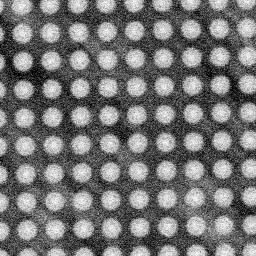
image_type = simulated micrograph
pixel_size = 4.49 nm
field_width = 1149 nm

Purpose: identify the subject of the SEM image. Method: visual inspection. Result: an array of small figures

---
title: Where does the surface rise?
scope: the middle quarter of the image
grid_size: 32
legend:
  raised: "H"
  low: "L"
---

LLHHHHLLLHHHLLLLHHHLLLLLHHLLLLLH
LLLLLLLLLLLLLLLLLLLLLLLLLLLLLLLL
LLLLLLLLLLLLLLLLLLLLLLLLLLLLLLLL
LLLLLLLLLLLLLLLLLLLLLLLLHHLLLLLH
LLHHHHLLLHHHHLLLHHHHLLLHHHHLLLHH
LLHHHHLLLHHHHLLLHHHHLLLHHHHLLLHH
LLHHHHLLLHHHHLLLHHHHLLLHHHHLLLHH
LLHHHHLLLHHHHLLLHHHHLLLLHHLLLLLH
LLLLLLLLLLLLLLLLLLLLLLLLLLLLLLLL
LLLLLLLLLLLLLLLLLLLLLLLLLLLLLLLL
LLLLLLLLLLLLLLLLLLLLLLLLHHLLLLLH
LLLHHHLLLHHHHLLLHHHHLLLHHHHLLLHH
LLHHHHLLLHHHHLLLHHHHLLLHHHHLLLHH
LLHHHHLLLHHHHLLLHHHHLLLHHHHLLLHH
LLHHHHLLLLHHHLLLLHHHLLLLHHHLLLLH
LLLLLLLLLLLLLLLLLLLLLLLLLLLLLLLL
LLLLLLLLLLLLLLLLLLLLLLLLLLLLLLLL
LLLLLLLLLLLLLLLLLLLLLLLLLHLLLLLH
LLLHHHLLLLHHHLLLLHHHLLLHHHHLLLHH
LLHHHHHLLHHHHHLLHHHHHLLHHHHHLLHH
LLHHHHHLLHHHHHLLHHHHHLLHHHHLLLHH
LLHHHHLLLLHHHLLLLHHHLLLLHHHLLLLH
LLLLLLLLLLLLLLLLLLLLLLLLLLLLLLLL
LLLLLLLLLLLLLLLLLLLLLLLLLLLLLLLL
LLLLLLLLLLLLLLLLLLLLLLLLLHLLLLLL
LLLHHHLLLLHHHLLLLHHHLLLLHHHHLLLH
LLHHHHHLLHHHHHLLHHHHHLLHHHHHLLHH
LLHHHHHLLHHHHHLLHHHHHLLHHHHHLLLH
LLLHHHLLLLHHHLLLLHHHLLLLHHHLLLLH
LLLLLLLLLLLLLLLLLLLLLLLLLLLLLLLL
LLLLLLLLLLLLLLLLLLLLLLLLLLLLLLLL
LLLLLLLLLLLLLLLLLLLLLLLLLHLLLLLL